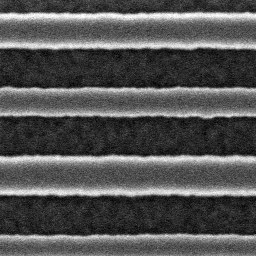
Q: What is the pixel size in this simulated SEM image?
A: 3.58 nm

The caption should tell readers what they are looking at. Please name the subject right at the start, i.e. lines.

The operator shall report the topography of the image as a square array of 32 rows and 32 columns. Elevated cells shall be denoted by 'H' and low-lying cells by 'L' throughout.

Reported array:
LLLLLLLLLLLLLLLLLLLLLLLLLLLLLLLL
LLLLLLLLLLLLLLLLLLLLLLLLLLLLLLLL
HHHHHHHHHHHHHHHHHHHHHHHHHHHHHHHH
HHHHHHHHHHHHHHHHHHHHHHHHHHHHHHHH
HHHHHHHHHHHHHHHHHHHHHHHHHHHHHHHH
HHHHHHHHHHHHHHHHHHHHHHHHHHHHHHHH
LLLLLLLLLLLLLLLLLLLLLLLLLLLLLLLL
LLLLLLLLLLLLLLLLLLLLLLLLLLLLLLLL
LLLLLLLLLLLLLLLLLLLLLLLLLLLLLLLL
LLLLLLLLLLLLLLLLLLLLLLLLLLLLLLLL
LLLLLLLLLLLLLLLLLLLLLLLLLLLLLLLL
HHHHHHHHHHHHHHHHHHHHHHHHHHHHHHHH
HHHHHHHHHHHHHHHHHHHHHHHHHHHHHHHH
HHHHHHHHHHHHHHHHHHHHHHHHHHHHHHHH
LLLLLLLLLLLLLLHLHLLLHLHHLHHLHLLL
LLLLLLLLLLLLLLLLLLLLLLLLLLLLLLLL
LLLLLLLLLLLLLLLLLLLLLLLLLLLLLLLL
LLLLLLLLLLLLLLLLLLLLLLLLLLLLLLLL
LLLLLLLLLLLLLLLLLLLLLLLLLLLLLLLL
LLLLLLLLLLLLLLLLLLLLLLLLLLLLLLLL
HHHHHHHHHHHHHHHHHHHHHHHHHHHHHHHH
HHHHHHHHHHHHHHHHHHHHHHHHHHHHHHHH
HHHHHHHHHHHHHHHHHHHHHHHHHHHHHHHH
HHHHHHHHHHHHHHHHHHHHHHHHHHHHHHHH
LLLLLLLLLLLLLLLLLLLLLLLLLLLLLLLL
LLLLLLLLLLLLLLLLLLLLLLLLLLLLLLLL
LLLLLLLLLLLLLLLLLLLLLLLLLLLLLLLL
LLLLLLLLLLLLLLLLLLLLLLLLLLLLLLLL
LLLLLLLLLLLLLLLLLLLLLLLLLLLLLLLL
HLHLHLLHHLLHHHHLHHHHHHHHHHHHHHLL
HHHHHHHHHHHHHHHHHHHHHHHHHHHHHHHH
HHHHHHHHHHHHHHHHHHHHHHHHHHHHHHHH